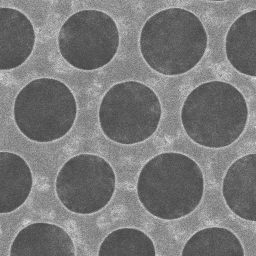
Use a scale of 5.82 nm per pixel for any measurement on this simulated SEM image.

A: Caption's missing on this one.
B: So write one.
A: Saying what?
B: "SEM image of holes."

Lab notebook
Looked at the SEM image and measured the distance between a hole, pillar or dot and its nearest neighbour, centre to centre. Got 487 nanometres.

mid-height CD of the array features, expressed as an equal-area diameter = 63.4 pixels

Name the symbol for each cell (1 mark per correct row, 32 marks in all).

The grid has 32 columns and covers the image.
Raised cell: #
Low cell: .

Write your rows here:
################################
..########...#######....#######.
....####......#####......####...
....####.......###........###...
....###........###........##....
....###........##.........##....
....####.......###........##....
...#####......####.......####...
..########..#######.....#####...
###############################.
###.....#######...#######....###
##.......####......#####......##
##.......####.......###........#
##........##........###........#
##.......###........###........#
##.......####.......###........#
###.....#####......####.......##
####...#######....######.....###
################################
..########..########...########.
...#####......####.......####...
....###.......####.......###....
....###.......###........###....
....###.......###........###....
...####.......###........###....
...#####.....#####.......###....
.########...#######.....#####...
###############################.
###.....##################..####
##.......####.....######.....###
#........####......####.......##
#........###.......####.......##